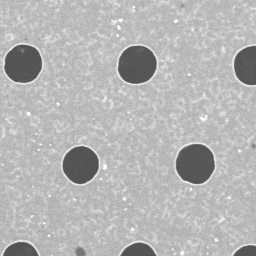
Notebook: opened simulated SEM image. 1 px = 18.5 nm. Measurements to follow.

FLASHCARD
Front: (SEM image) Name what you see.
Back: holes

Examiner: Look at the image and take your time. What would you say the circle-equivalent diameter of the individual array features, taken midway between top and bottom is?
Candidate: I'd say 715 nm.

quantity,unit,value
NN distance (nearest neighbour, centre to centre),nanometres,2120